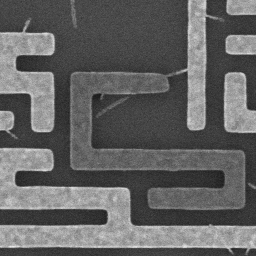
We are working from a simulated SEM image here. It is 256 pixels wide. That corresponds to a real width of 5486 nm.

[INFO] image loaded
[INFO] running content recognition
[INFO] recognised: wiring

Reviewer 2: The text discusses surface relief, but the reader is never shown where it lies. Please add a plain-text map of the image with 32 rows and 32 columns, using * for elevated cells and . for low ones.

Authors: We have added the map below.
........................**..****
........................**...***
........................**......
........................**......
*******.................**...***
*******.................**..****
*******.................**...***
**......................**......
**.....................***......
*******..************...**..***.
*******..************...**..***.
*******..***********....**..***.
....***..**.............**..***.
....***..**............***..***.
**..***..**............***..****
**..***..**............***..****
.........**..................***
.........**.....................
.........***....................
*******..**********************.
*******..**********************.
**..........................***.
**..........................***.
*************.*............****.
****************...************.
****************...************.
.............***................
.............***................
********************************
********************************
********************************
................................